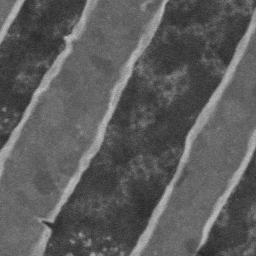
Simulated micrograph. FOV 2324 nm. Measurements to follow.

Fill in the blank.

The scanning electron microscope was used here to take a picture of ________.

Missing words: one or a few lines or trenches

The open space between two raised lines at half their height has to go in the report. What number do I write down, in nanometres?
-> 796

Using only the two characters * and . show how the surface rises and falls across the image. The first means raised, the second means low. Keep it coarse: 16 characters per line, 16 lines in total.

*....*****......
.....*****......
....*****......*
....****.......*
...*****......**
...****.......**
..*****......***
..*****......***
.*****......****
******......****
*****......****.
****.......****.
****......****..
***.......***...
***......****...
***......***....